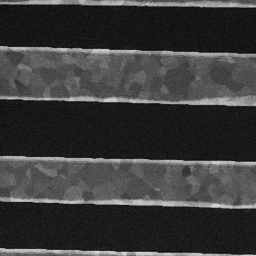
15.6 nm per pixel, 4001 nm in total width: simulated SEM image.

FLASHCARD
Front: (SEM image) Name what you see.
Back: lines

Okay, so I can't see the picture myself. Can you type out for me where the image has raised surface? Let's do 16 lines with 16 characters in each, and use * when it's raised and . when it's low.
................
................
................
****************
****************
****************
................
................
................
................
****************
****************
****************
................
................
................